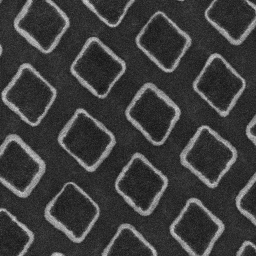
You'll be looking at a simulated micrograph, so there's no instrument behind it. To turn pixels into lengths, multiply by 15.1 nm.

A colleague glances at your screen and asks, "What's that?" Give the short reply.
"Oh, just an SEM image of a regular array of raised bodies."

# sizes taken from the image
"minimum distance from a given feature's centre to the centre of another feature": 1050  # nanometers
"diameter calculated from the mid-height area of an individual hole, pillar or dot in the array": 725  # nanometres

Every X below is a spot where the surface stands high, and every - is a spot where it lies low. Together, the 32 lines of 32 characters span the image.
---XXXX----XXXXX----------XXXXX-
---XXXXX----XXXX----------XXXXXX
--XXXXXX-----XX----XX-----XXXXXX
--XXXXXX----------XXXX-----XXXXX
---XXXXX---------XXXXXX-----XXX-
----XXX----XX----XXXXXX---------
----------XXXX----XXXXX---------
---------XXXXXX----XXX----XX----
---X-----XXXXXXX----XX---XXXX---
--XXX-----XXXXX----------XXXXX--
-XXXXX-----XXX----------XXXXXXX-
-XXXXXX-----X-----XX-----XXXXX--
-XXXXXX----------XXXX-----XXX---
--XXXX----------XXXXXX-----XX---
---XX----XX-----XXXXXX----------
----X----XXX-----XXXXX---------X
--------XXXXXX----XXX----XX----X
-X------XXXXXX-----XX---XXXX----
XXX-----XXXXXX---------XXXXXX---
XXXX-----XXXX----------XXXXXX---
XXXXX-----XX----XXX----XXXXXX---
XXXXX----------XXXXX----XXXX----
XXXX-----------XXXXXX-----X-----
-XXX----XX-----XXXXXX----------X
-------XXXX----XXXXX----------XX
------XXXXXX----XXX-----X-----XX
X-----XXXXXX-----------XXX----XX
XX----XXXXXX----------XXXXX-----
XXX-----XXX----X------XXXXXX----
XXXX-----XX---XXX-----XXXXX-----
XXXX----------XXXX-----XXXX-----
XXX----------XXXXXX-----XX----XX